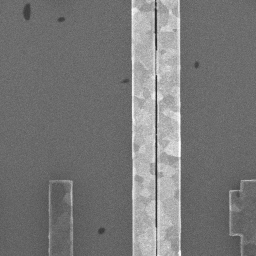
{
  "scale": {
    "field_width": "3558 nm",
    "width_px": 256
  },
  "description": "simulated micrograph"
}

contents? wiring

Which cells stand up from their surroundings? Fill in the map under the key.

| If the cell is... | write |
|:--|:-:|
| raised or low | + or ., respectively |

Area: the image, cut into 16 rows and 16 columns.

........+++.....
........+++.....
........+++.....
........+++.....
........+++.....
........+++.....
........+++.....
........+++.....
........+++.....
........+++.....
........+++.....
...+....+++....+
...+....+++...++
...++...+++...++
...++...+++....+
...++...+++....+